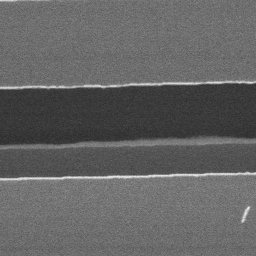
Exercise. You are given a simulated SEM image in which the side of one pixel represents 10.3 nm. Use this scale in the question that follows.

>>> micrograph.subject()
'lines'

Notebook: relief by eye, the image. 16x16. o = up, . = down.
oooooooooooooooo
oooooooooooooooo
oooooooooooooooo
oooooooooooooooo
oooooooooooooooo
oo..............
................
................
................
................
................
oooooooooooooooo
oooooooooooooooo
oooooooooooooooo
oooooooooooooooo
oooooooooooooooo